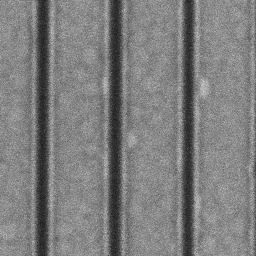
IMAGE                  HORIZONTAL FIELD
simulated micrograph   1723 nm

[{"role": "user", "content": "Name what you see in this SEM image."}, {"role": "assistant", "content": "one or a few lines or trenches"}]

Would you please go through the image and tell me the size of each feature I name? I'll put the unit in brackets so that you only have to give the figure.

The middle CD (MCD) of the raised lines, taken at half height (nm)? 132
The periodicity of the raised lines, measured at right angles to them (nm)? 490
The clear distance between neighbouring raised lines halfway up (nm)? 363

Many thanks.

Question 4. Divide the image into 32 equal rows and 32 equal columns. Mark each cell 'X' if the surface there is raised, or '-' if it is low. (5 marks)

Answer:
----XXX------XXX-------XX------X
----XXX------XXX-------XX-------
----XXX------XXX-------XX-------
----XXX------XXX------XXX-------
----XXX------XXX------XXX-------
----XXX------XXX------XXX-------
----XXX------XXX------XXX------X
----XXX------XXX------XXX------X
----XXX------XXX------XXX-------
----XXX------XXX------XXX-------
----XXX------XXX------XXX-------
----XXX------XXX------XXX-------
----XXX------XXX------XXX-------
----XXX------XXX------XXX------X
----XXX------XXX------XXX------X
----XXX------XXX------XXX-------
----XXX------XXX------XXX-------
----XX-------XXX------XXX------X
----XX-------XXX------XXX-------
----XX-------XXX------XXX------X
----XX-------XXX------XXX------X
----XX-------XXX------XXX------X
----XX-------XXX------XXX------X
----XX-------XXX------XXX------X
----XX-------XXX------XXX------X
----XX-------XXX------XXX------X
----XX-------XXX------XXX------X
----XX-------XXX------XXX------X
----XX-------XXX------XXX------X
----XX-------XXX------XXX------X
----XX-------XXX------XXX------X
----XX-------XXX------XXX------X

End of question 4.